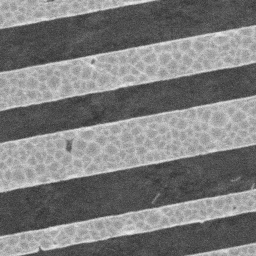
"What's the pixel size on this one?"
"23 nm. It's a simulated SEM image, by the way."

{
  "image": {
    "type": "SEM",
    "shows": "one or a few lines or trenches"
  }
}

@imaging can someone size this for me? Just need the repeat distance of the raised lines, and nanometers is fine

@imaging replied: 1760